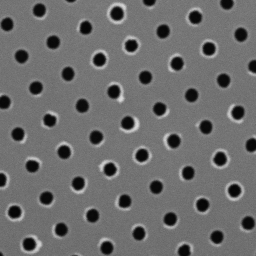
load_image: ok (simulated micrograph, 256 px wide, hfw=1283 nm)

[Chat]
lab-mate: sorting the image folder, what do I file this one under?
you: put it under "a regular array of holes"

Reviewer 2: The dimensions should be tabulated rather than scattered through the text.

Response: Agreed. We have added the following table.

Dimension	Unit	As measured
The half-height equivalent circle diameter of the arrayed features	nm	65.2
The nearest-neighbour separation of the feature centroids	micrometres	0.174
